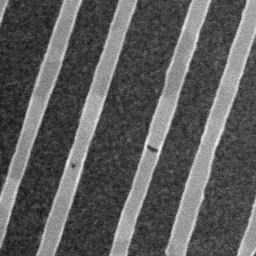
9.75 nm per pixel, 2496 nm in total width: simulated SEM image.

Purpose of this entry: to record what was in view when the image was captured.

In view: one or a few lines or trenches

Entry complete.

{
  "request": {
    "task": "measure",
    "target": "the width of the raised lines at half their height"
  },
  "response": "164 nm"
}